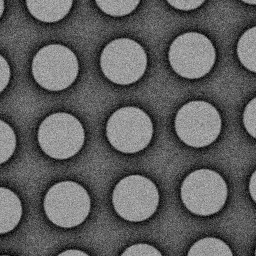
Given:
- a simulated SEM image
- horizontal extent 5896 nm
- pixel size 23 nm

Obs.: an array of small figures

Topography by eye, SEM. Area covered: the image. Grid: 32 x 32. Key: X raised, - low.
---XXXXXX---XXXXX----XXXX-------
----XXXX-----XXX----------------
-----XX-------------------------
--------------------------------
-----------------------XX-----XX
--------------XXX-----XXXX----XX
-----XXXX----XXXXX---XXXXXX---XX
X---XXXXXX---XXXXX---XXXXXX---XX
X---XXXXXX---XXXXX----XXXX-----X
X---XXXXXX---XXXXX-----XX-------
X----XXXX------X----------------
--------------------------------
--------------------------------
---------------XX------XXXX----X
------XXX-----XXXX----XXXXX---XX
X----XXXXX---XXXXXX---XXXXXX---X
XX---XXXXX---XXXXXX---XXXXX----X
XX---XXXXX----XXXXX----XXXX-----
XX---XXXXX----XXXX--------------
X-----XXX-----------------------
--------------------------------
------------------------XXX-----
---------------XXXX----XXXXX---X
------XXXX----XXXXX----XXXXX---X
XX----XXXXX---XXXXXX---XXXXX---X
XXX---XXXXX---XXXXXX---XXXXX----
XXX---XXXXX----XXXX-----XXX-----
XX----XXXX------XX--------------
XX------------------------------
--------------------------------
------------------------XXXX----
--------XX------XXXX----XXXXX---